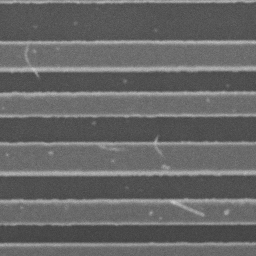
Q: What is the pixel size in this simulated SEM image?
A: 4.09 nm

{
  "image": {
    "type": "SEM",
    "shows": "lines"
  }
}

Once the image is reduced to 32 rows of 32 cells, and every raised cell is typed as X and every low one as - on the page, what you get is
--------------------------------
--------------------------------
--------------------------------
--------------------------------
--------------------------------
XXXXXXXXXXXXXXXXXXXXXXXXXXXXXXXX
XXXXXXXXXXXXXXXXXXXXXXXXXXXXXXXX
XXXXXXXXXXXXXXXXXXXXXXXXXXXXXXXX
XXXXXXXXXXXXXXXXXXXXXXXXXXXXXXXX
--------------------------------
--------------------------------
-------------------------X-XX--X
XXXXXXXXXXXXXXXXXXXXXXXXXXXXXXXX
XXXXXXXXXXXXXXXXXXXXXXXXXXXXXXXX
XXXXXXXXXXXXXXXXXXXXXXXXXXXXXXXX
--------------------------------
--------------------------------
--------------------------------
XXXXXXXXXXXXXXXXXXXXXXXXXXXXXXXX
XXXXXXXXXXXXXXXXXXXXXXXXXXXXXXXX
XXXXXXXXXXXXXXXXXXXXXXXXXXXXXXXX
XXXXXXXXXXXXXXXXXXXXXXXXXXXXXXXX
--------------------------------
--------------------------------
--------------------------------
XXXXXXXXXXXXXXXXXXXXXXXXXXXXXXXX
XXXXXXXXXXXXXXXXXXXXXXXXXXXXXXXX
XXXXXXXXXXXXXXXXXXXXXXXXXXXXXXXX
--------------------------------
--------------------------------
-XX--XXXXXXXXXXXXXXXXXXXXXXXXXXX
XXXXXXXXXXXXXXXXXXXXXXXXXXXXXXXX